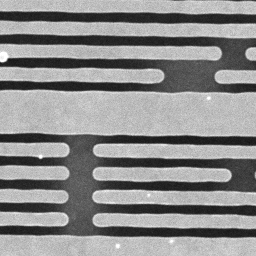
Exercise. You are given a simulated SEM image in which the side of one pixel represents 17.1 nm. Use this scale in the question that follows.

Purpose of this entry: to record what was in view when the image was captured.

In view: groups of lines, slits or small figures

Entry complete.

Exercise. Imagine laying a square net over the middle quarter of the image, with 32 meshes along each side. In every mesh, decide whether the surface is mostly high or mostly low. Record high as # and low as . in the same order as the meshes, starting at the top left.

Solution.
................................
################....###.........
#########################.......
#########################.......
.......##...############........
................................
................................
##########################..####
################################
################################
################################
################################
################################
################################
################################
################################
################################
####..##########################
................................
................................
#.......########################
#......#########################
#.......########################
................................
................................
................................
#.......########################
#......#########################
#.......########################
................................
................................
................................